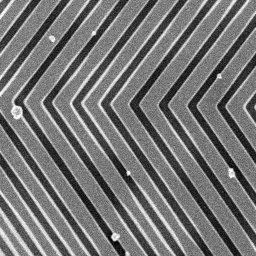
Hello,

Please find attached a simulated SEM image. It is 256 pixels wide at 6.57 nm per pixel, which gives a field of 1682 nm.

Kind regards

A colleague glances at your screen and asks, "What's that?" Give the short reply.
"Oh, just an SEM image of groups of lines, slits or small figures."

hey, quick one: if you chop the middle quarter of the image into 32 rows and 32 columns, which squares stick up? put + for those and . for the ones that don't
+...++++...+++++...++++...+++++.
...+++++...++++...+++++..+++++..
...++++...++++...+++++..+++++...
..++++...+++++...++++...+++++..+
.++++....++++...++++...+++++..++
+++++...++++...+++++..+++++..+++
++++...++++...+++++..+++++...+++
+++...+++++...++++...+++++..++++
++...+++++...++++...+++++..+++++
++...++++...++++...+++++..+++++.
++...++++...++++...+++++..+++++.
++....++++..+++++..+++++...++++.
+++...++++...+++++..+++++...++++
++++...++++...+++++..++++...++++
.++++...++++...++++...++++...+++
.++++...+++++..+++++..+++++...++
..++++...++++...++++...++++...++
...++++...++++...++++...++++...+
...++++....++++..+++++...++++...
+...++++...++++...++++...++++...
++...++++...++++...++++...++++..
++...+++++..+++++..+++++...++++.
+++...++++...+++++..++++....++++
++++...++++...++++...++++...++++
+++++..+++++..+++++..+++++...+++
.++++...++++...++++...++++...+++
..++++...++++...++++...++++...++
..+++++..+++++..+++++...++++...+
...++++...+++++..++++...+++++..+
+..+++++...++++...++++...++++...
++..+++++..+++++...++++...++++..
++...+++++..++++...++++...+++++.